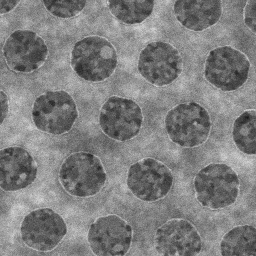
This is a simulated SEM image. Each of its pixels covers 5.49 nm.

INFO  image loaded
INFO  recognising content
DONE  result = a regular array of raised bodies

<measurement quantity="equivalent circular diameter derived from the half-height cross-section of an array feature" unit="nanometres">254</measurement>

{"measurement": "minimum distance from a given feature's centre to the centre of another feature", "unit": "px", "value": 67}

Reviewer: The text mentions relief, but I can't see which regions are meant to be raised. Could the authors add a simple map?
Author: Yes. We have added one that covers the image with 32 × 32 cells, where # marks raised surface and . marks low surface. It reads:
#....######..######...######...#
......####....#####...######..##
...............###....#####....#
.......................###.....#
.####......#....................
######...#####....###...........
######...######...####....####..
.#####...######..######...#####.
.####....#####...######...#####.
..........####....####....#####.
...................##.....#####.
......##........................
#...#####....####...............
#...######...#####....####......
#...######..######...#####....##
....#####...######...#####...###
......##.....####....#####...###
..............##.....#####...###
.##...........................##
####.....###....................
#####...#####....###......##....
#####..######...#####....####...
####...######...######..######..
###.....#####...#####...######..
.........##......###....######..
.........................####...
....###.........................
...#####....###.................
...#####...#####.....##......###
...#####...######......#....####
...####....#####.....##.....####
............####......#.....####